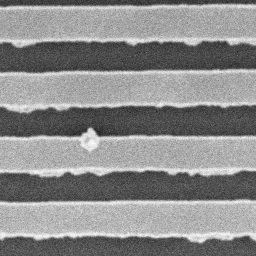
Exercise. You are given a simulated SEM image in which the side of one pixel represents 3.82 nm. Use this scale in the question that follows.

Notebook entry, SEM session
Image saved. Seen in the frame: lines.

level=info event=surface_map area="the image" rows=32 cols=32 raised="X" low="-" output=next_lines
--------------------------------
XXXXXXXXXXXXXXXXXXXXXXXXXXXXXXXX
XXXXXXXXXXXXXXXXXXXXXXXXXXXXXXXX
XXXXXXXXXXXXXXXXXXXXXXXXXXXXXXXX
XXXXXXXXXXXXXXXXXXXXXXXXXXXXXXXX
--------------------------------
--------------------------------
--------------------------------
--------------------------------
XXXXXXXXXXXXXXXXXXXXXXXXXXXXXXXX
XXXXXXXXXXXXXXXXXXXXXXXXXXXXXXXX
XXXXXXXXXXXXXXXXXXXXXXXXXXXXXXXX
XXXXXXXXXXXXXXXXXXXXXXXXXXXXXXXX
--X-----------------------------
--------------------------------
--------------------------------
-----------X--------------------
XXXXXXXXXXXXXXXXXXXXXXXXXXXXXXXX
XXXXXXXXXXXXXXXXXXXXXXXXXXXXXXXX
XXXXXXXXXXXXXXXXXXXXXXXXXXXXXXXX
XXXXXXXXXXXXXXXXXXXXXXXXXXXXXXXX
XXXXXX-X--------------XX--------
--------------------------------
--------------------------------
--------------------------------
XXXXXXXXXXXXXXXXXXXXXXXXXXXXXXXX
XXXXXXXXXXXXXXXXXXXXXXXXXXXXXXXX
XXXXXXXXXXXXXXXXXXXXXXXXXXXXXXXX
XXXXXXXXXXXXXXXXXXXXXXXXXXXXXXXX
XX-XXXXX-----XXXXXXXXXXXXX---X--
--------------------------------
--------------------------------